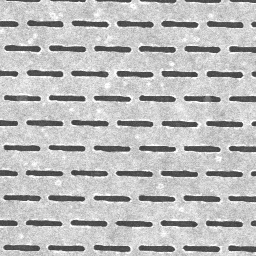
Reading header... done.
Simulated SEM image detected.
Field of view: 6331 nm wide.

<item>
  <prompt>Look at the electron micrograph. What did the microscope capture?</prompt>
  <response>a regular array of holes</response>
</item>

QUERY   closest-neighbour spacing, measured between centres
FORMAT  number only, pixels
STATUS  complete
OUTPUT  33.2